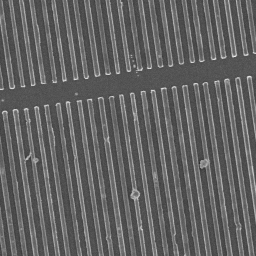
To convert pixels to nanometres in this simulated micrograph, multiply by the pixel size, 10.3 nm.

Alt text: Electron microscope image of parallel lines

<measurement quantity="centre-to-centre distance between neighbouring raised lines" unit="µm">0.11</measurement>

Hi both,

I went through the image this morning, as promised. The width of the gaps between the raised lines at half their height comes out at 66.1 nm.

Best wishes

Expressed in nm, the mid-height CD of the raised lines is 47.